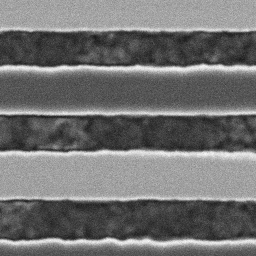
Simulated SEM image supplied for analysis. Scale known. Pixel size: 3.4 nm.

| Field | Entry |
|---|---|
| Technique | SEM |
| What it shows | lines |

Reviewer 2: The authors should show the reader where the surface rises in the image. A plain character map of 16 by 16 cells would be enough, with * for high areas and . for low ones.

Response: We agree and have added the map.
****************
****************
................
................
****************
****************
****************
................
................
**....***.......
****************
****************
..............**
................
................
****************